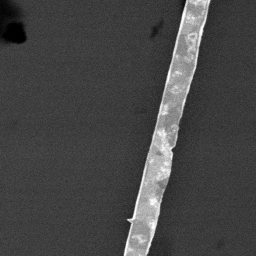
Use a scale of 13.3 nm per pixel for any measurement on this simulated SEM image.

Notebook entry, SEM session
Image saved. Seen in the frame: one or a few lines or trenches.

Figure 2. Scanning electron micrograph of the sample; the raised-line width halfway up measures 307 nm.